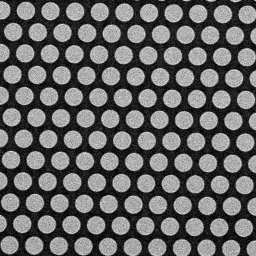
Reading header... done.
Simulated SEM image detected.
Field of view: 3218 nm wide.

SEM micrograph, an array of small figures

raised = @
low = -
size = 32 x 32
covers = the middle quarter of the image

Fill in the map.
--------------------------------
@---@@@---@@@---@@@----@@----@@-
@@--@@@@--@@@@--@@@@--@@@@--@@@@
@---@@@@--@@@@--@@@@--@@@@--@@@@
@---@@@---@@@---@@@@--@@@@--@@@@
--------------------------------
-@@@---@@@----@@----@@----------
@@@@@--@@@@--@@@@--@@@@--@@@@--@
@@@@@--@@@@--@@@@--@@@@--@@@@--@
-@@@---@@@---@@@@--@@@@--@@@@--@
--------------@-----@@----@@----
--------------------------------
@---@@@---@@@---@@@---@@@@--@@@@
@--@@@@@-@@@@@--@@@@--@@@@--@@@@
@---@@@---@@@@--@@@@--@@@@--@@@@
----@@----@@@---@@@---@@@---@@@@
--------------------------------
-@@@---@@@---@@@---@@@----@@----
@@@@--@@@@--@@@@@--@@@@--@@@@--@
@@@@--@@@@--@@@@@--@@@@--@@@@--@
-@@@---@@@---@@@---@@@---@@@@--@
--------------------------------
----@@----@@--------------------
@--@@@@--@@@@---@@@---@@@@--@@@@
@--@@@@--@@@@--@@@@@--@@@@--@@@@
@--@@@@--@@@@---@@@---@@@@--@@@@
-----------------@@----@@----@@-
-@@-----@-----------------------
@@@@--@@@@---@@@---@@@---@@@---@
@@@@--@@@@--@@@@---@@@@--@@@@--@
@@@@--@@@@--@@@@---@@@@--@@@@--@
-@@----@@----@@@---@@@---@@@---@